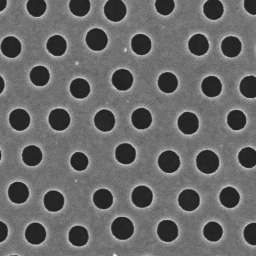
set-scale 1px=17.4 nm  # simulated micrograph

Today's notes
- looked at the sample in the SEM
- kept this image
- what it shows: a regular array of holes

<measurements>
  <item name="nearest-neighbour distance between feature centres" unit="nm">656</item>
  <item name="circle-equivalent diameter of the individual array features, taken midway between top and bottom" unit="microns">0.377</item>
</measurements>